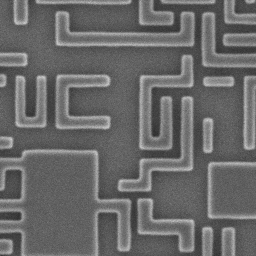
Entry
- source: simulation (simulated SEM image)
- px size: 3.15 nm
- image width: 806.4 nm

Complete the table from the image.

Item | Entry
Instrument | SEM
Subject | wiring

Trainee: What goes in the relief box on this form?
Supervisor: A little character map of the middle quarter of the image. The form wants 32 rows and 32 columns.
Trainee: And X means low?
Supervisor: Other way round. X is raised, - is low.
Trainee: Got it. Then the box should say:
------------------------------XX
------------------------------XX
-----------------------------XXX
XXXXXXXXXXX--------XXXXXXXXXXXXX
XXXXXXXXXXX--------XXXXXXXXXXXXX
XXXXXX-------------XXXXXXXXXXXXX
X------------------XXX----------
X------------------XXX----------
X------------------XXX---XX---XX
X------------------XXX--XXX---XX
X------------------XXX--XXX---XX
X------------------XXX--XXX---XX
X------------------XXX--XXX---XX
XXXXXXXXXXX--------XXX--XXX---XX
XXXXXXXXXXX--------XXX--XXX---XX
XXXXXXXXXXX--------XXX--XXX---XX
-------------------XXX--XXX--XXX
-------------------XXX--XXX--XXX
-------------------XXXXXXXX--XXX
-------------------XXXXXXXX--XXX
-------------------XXXXXXXX--XXX
------------------------------XX
XXXXXXXX----------------------XX
XXXXXXXX---------------------XXX
XXXXXXXX-----------XXXXXXXXXXXXX
XXXXXXXX-----------XXXXXXXXXXXXX
XXXXXXXX-----------XXXX-XXXXXXXX
XXXXXXXX-----------XXX----------
XXXXXXXX-----------XXX----------
XXXXXXXX------XXXXXXXX----------
XXXXXXXX------XXXXXXXX----------
XXXXXXXX------XXXXXXX-----------